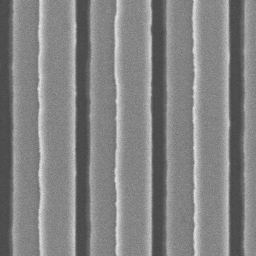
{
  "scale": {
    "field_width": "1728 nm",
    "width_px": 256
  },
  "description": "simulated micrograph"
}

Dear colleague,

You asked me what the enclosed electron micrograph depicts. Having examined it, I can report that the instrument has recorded lines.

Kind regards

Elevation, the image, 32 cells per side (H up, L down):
LLHHHHHHHLLHHHHHHHHLLHHHHHHHHLLH
LLHHHHHHHLLHHHHHHHHLLHHHHHHHHLLH
LLHHHHHHHLLHHHHHHHHLLHHHHHHHHLLH
LLHHHHHHHLLHHHHHHHHLLHHHHHHHHLLH
LLHHHHHHHLLHHHHHHHHLLHHHHHHHHLLH
LLHHHHHHHLLHHHHHHHHLLHHHHHHHHLLH
LLHHHHHHHLLHHHHHHHHLLHHHHHHHHLLH
LLHHHHHHHLLHHHHHHHHLLHHHHHHHHLLH
LLHHHHHHHLLHHHHHHHHLLHHHHHHHHLLH
LLHHHHHHHLLHHHHHHHHLLHHHHHHHHLLH
LLHHHHHHHLLHHHHHHHHLLHHHHHHHHLLH
LLHHHHHHHLLHHHHHHHHLLHHHHHHHHLLH
LLHHHHHHHLLHHHHHHHHLLHHHHHHHHLLH
LLHHHHHHHLLHHHHHHHHLLHHHHHHHHLLH
LLHHHHHHHLLHHHHHHHHLLHHHHHHHHLLH
LLHHHHHHHLLHHHHHHHHLLHHHHHHHHLLH
LLHHHHHHHLLHHHHHHHHLLHHHHHHHHLLH
LLHHHHHHHLLHHHHHHHHLLHHHHHHHHLLH
LLHHHHHHHLLHHHHHHHHLLHHHHHHHHLLH
LLHHHHHHHLLHHHHHHHHLLHHHHHHHHLLH
LLHHHHHHHLLHHHHHHHHLLHHHHHHHHLLH
LLHHHHHHHLLHHHHHHHHLLHHHHHHHHLLH
LLHHHHHHHLLHHHHHHHHLLHHHHHHHHLLH
LLHHHHHHHLLHHHHHHHHLLHHHHHHHHLLH
LLHHHHHHHLLHHHHHHHHLLHHHHHHHHLLH
LLHHHHHHHLLHHHHHHHHLLHHHHHHHHLLH
LLHHHHHHHLLHHHHHHHHLLHHHHHHHHLLH
LLHHHHHHHLLHHHHHHHHLLHHHHHHHHLLH
LLHHHHHHHLLHHHHHHHHLLHHHHHHHHLLH
LLHHHHHHHLLHHHHHHHHLLHHHHHHHHLLH
LLHHHHHHHLLHHHHHHHHLLHHHHHHHHLLH
LLHHHHHHHLLHHHHHHHHLLHHHHHHHHLLH